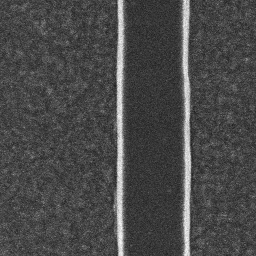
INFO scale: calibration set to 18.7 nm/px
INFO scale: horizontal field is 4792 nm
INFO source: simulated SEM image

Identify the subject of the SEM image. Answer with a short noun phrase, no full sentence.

one or a few lines or trenches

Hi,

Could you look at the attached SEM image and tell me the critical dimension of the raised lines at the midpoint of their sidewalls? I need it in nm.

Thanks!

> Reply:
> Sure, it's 1250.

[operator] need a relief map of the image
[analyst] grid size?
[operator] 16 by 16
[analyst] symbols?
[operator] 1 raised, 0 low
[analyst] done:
0000000011110000
0000000011110000
0000000011110000
0000000011110000
0000000111110000
0000000111110000
0000000111110000
0000000111110000
0000000011110000
0000000011110000
0000000011110000
0000000011110000
0000000011110000
0000000011110000
0000000011110000
0000000011110000